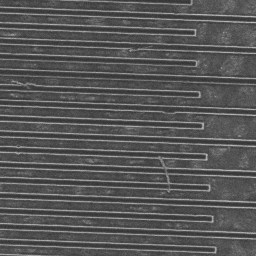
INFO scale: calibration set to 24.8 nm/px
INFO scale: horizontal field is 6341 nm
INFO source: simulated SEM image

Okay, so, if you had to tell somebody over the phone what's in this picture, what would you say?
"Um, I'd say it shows parallel lines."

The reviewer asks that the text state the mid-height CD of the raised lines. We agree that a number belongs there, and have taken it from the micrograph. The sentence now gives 161 nm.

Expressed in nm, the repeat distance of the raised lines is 383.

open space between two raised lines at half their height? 232 nm